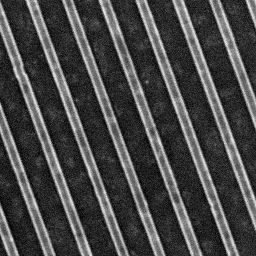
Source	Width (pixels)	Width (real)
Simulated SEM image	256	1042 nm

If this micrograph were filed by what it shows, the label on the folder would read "parallel lines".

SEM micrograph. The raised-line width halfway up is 34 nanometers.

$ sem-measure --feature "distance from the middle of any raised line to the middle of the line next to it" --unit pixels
34.4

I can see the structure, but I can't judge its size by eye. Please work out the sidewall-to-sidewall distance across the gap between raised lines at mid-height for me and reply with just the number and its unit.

106 nm